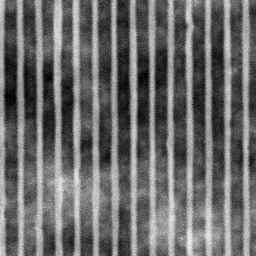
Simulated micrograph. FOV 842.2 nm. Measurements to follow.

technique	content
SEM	parallel lines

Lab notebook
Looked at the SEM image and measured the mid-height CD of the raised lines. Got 5.14 pixels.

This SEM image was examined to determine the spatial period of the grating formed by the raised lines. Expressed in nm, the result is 61.8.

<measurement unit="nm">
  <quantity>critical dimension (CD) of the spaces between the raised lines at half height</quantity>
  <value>45.3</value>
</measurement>